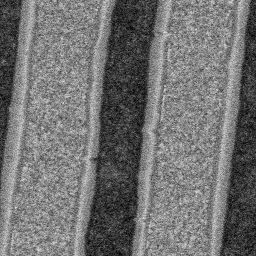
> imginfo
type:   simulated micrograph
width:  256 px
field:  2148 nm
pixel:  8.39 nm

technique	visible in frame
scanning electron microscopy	one or a few lines or trenches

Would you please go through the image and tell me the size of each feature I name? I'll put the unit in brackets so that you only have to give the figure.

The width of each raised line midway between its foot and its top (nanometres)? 659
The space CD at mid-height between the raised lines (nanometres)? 475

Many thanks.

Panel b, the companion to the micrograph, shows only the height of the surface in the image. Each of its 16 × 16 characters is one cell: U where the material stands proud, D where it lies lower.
DDUUUUUDDDUUUUUD
DDUUUUUDDDUUUUUD
DDUUUUDDDDUUUUUD
DUUUUUDDDDUUUUUD
DUUUUUDDDDUUUUUD
DUUUUUDDDDUUUUUD
DUUUUUDDDDUUUUDD
DUUUUUDDDUUUUUDD
DUUUUUDDDUUUUUDD
DUUUUUDDDUUUUUDD
DUUUUUDDDUUUUUDD
UUUUUUDDDUUUUUDD
UUUUUDDDDUUUUUDD
UUUUUDDDDUUUUUDD
UUUUUDDDDUUUUUDD
UUUUUDDDDUUUUDDD